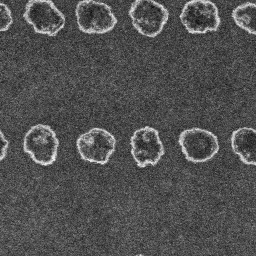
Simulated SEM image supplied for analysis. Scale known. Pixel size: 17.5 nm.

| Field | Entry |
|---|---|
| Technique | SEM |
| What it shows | raised bodies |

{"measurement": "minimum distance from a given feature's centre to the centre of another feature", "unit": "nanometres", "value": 896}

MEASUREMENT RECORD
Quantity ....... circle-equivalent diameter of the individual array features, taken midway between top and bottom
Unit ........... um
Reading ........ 0.597